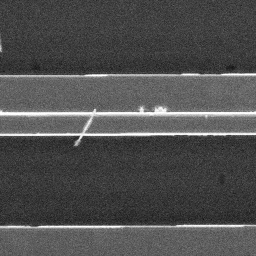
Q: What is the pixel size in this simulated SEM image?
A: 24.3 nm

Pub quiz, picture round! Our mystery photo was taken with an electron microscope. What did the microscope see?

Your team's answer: lines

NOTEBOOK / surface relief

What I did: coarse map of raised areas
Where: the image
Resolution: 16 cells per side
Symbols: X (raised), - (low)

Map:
----------------
----------------
----------------
----------------
----------------
XXXXXXXXXXXXXXXX
XXXXXXXXXXXXXXXX
XXXXXXXXXXXXXXXX
----------------
----------------
----------------
----------------
----------------
----------------
XXXXXXXXXXXXXXXX
XXXXXXXXXXXXXXXX